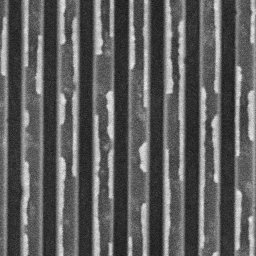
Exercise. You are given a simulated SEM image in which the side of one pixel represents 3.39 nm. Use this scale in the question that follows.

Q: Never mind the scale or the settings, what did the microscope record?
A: parallel lines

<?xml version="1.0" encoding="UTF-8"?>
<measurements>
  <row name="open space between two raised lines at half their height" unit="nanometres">52.1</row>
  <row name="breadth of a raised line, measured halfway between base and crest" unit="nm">70.3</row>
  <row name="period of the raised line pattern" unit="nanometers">120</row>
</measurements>